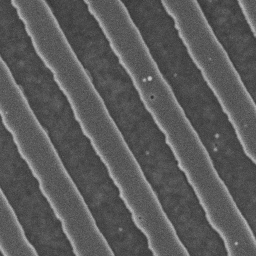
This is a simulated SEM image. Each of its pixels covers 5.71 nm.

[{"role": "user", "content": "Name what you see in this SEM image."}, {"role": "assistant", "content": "lines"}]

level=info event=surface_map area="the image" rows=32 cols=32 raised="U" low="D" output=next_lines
DDUUUUDDDDDUUUUDDDDDUUUUUDDDDDUU
DDUUUUDDDDDUUUUUDDDDDUUUUDDDDDUU
DDDUUUUDDDDDUUUUDDDDDDUUUUDDDDDU
DDDUUUUUDDDDDUUUUDDDDDUUUUDDDDDU
DDDDUUUUDDDDDUUUUUDDDDUUUUUDDDDD
DDDDUUUUUDDDDDUUUUDDDDDUUUUUDDDD
DDDDDUUUUDDDDDUUUUUDDDDDUUUUDDDD
DDDDDUUUUUDDDDDUUUUDDDDDUUUUUDDD
UDDDDDUUUUDDDDDDUUUUDDDDDUUUUDDD
UUDDDDDUUUUDDDDDUUUUDDDDDUUUUUDD
UUDDDDDUUUUUDDDDDUUUUDDDDDUUUUDD
UUUDDDDDUUUUDDDDDUUUUUDDDDDUUUUD
UUUDDDDDDUUUUDDDDDUUUUDDDDDUUUUU
UUUUDDDDDUUUUDDDDDUUUUUDDDDDUUUU
UUUUDDDDDUUUUUDDDDDUUUUDDDDDUUUU
UUUUUDDDDDUUUUDDDDDDUUUUDDDDDUUU
DUUUUUDDDDUUUUUDDDDDUUUUDDDDDUUU
DDUUUUDDDDDUUUUUDDDDDUUUUDDDDDUU
DDUUUUUDDDDDUUUUDDDDDUUUUUDDDDUU
DDDUUUUDDDDDUUUUUDDDDDUUUUDDDDDU
DDDUUUUUDDDDDUUUUDDDDDUUUUUDDDDD
DDDDUUUUDDDDDDUUUUDDDDDUUUUDDDDD
DDDDDUUUUDDDDDUUUUDDDDDUUUUUDDDD
DDDDDUUUUUDDDDDUUUUDDDDDUUUUDDDD
UDDDDDUUUUDDDDDUUUUUDDDDDUUUUDDD
UDDDDDUUUUUDDDDDUUUUDDDDDUUUUDDD
UUDDDDDUUUUDDDDDUUUUUDDDDDUUUUDD
UUDDDDDUUUUUDDDDDUUUUDDDDDUUUUUD
UUUDDDDDUUUUDDDDDUUUUUDDDDDUUUUD
UUUDDDDDUUUUUDDDDDUUUUDDDDDDUUUU
UUUUDDDDDUUUUDDDDDDUUUUDDDDDUUUU
UUUUUDDDDUUUUUDDDDDUUUUDDDDDUUUU